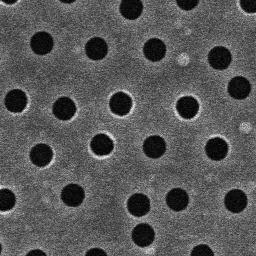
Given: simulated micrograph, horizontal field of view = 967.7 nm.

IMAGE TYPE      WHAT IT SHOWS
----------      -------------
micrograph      a regular array of holes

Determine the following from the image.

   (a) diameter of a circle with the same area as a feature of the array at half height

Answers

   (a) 90.4 nanometres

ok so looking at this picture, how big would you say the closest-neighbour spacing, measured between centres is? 188 nanometres